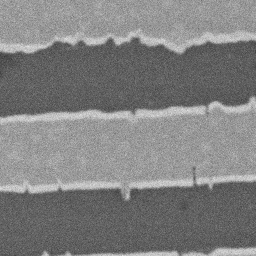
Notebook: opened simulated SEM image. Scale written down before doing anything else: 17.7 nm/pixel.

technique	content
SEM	one or a few lines or trenches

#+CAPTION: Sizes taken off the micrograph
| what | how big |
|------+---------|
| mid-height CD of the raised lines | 1.24 µm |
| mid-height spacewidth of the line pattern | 1280 nanometers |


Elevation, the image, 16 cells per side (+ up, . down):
++++++++++++++++
++++++++++++++++
++++...+.++++...
................
................
................
................
++++++++++++++++
++++++++++++++++
++++++++++++++++
++++++++++++++++
++++++++++......
................
................
................
................